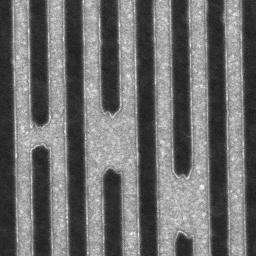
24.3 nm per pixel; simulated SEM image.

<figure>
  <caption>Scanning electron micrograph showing parallel lines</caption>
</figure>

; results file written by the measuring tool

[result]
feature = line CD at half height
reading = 492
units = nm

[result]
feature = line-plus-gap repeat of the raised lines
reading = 861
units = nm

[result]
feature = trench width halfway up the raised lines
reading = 0.364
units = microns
